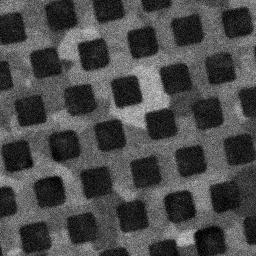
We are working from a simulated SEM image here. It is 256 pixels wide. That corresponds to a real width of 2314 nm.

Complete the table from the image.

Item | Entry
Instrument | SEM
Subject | a regular array of holes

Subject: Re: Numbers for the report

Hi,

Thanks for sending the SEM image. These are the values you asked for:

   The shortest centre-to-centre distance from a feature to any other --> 422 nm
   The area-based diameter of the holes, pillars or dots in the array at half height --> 0.307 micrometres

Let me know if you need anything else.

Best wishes